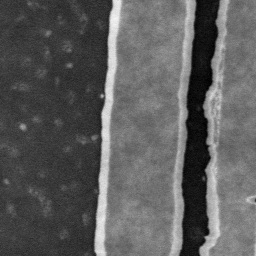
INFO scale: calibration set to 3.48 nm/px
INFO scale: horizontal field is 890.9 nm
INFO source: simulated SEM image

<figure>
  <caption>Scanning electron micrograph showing one or a few lines or trenches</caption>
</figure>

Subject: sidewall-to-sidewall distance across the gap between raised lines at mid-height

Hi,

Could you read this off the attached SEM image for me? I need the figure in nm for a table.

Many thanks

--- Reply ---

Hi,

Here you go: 108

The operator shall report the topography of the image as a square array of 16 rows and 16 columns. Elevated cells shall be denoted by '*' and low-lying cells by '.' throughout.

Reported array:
.......*****..**
.......*****..**
.......*****..**
.......*****..**
.......*****.***
.......****..***
.......****..***
.......****..***
.......****..***
.......****..***
.......****..***
......*****..***
......*****..***
......*****..***
......*****..***
......*****..***